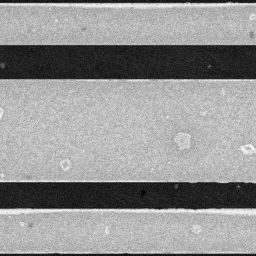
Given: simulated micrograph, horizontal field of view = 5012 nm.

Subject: lines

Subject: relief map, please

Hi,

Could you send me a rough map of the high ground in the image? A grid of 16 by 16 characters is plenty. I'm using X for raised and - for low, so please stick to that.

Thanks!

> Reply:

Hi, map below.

XXXXXXXXXXXXXXXX
XXXXXXXXXXXXXXXX
XXXXXXXXXXXXXXXX
----------------
----------------
XXXXXXXXXXXXXXXX
XXXXXXXXXXXXXXXX
XXXXXXXXXXXXXXXX
XXXXXXXXXXXXXXXX
XXXXXXXXXXXXXXXX
XXXXXXXXXXXXXXXX
----------------
----------------
XXXXXXXXXXXXXXXX
XXXXXXXXXXXXXXXX
XXXXXXXXXXXXXXXX